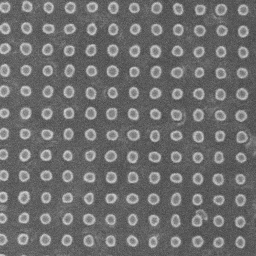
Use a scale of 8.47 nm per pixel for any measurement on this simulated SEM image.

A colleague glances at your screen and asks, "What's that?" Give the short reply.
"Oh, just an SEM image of a regular array of raised bodies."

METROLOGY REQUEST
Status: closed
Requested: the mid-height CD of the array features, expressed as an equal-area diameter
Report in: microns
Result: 0.0902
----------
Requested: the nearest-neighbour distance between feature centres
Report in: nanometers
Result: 176